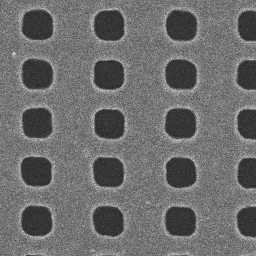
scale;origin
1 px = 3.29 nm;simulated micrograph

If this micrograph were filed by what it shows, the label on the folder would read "a regular array of holes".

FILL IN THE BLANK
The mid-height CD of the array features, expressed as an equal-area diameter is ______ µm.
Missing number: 0.105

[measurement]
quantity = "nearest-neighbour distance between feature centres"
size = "160 nm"